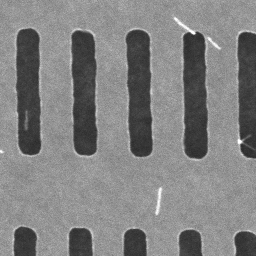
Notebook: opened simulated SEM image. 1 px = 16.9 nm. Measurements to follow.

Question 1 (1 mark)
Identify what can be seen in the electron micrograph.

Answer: holes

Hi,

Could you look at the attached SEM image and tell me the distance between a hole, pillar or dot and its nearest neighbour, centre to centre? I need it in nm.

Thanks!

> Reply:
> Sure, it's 939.